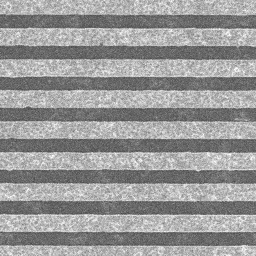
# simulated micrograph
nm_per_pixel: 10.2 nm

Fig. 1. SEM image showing parallel lines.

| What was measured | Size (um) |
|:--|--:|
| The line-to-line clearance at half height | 0.146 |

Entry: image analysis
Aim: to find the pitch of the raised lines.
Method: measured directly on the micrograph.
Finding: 316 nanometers